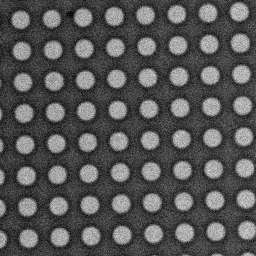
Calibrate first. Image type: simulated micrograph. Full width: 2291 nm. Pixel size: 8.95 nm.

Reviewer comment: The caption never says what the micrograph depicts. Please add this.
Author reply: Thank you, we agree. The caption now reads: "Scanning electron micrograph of an array of small figures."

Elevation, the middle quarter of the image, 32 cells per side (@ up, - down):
--------------------------------
--------------------@@-----@@@--
----@@@----@@@@----@@@@----@@@@-
---@@@@----@@@@----@@@@----@@@@-
---@@@@@---@@@@----@@@@----@@@@-
----@@@-----@@------@@----------
--------------------------------
--------------------------------
--------------------------------
-------------@------@@@----@@@@-
----@@@-----@@@----@@@@----@@@@-
---@@@@@---@@@@@---@@@@----@@@@-
----@@@@----@@@----@@@@----@@@@-
----@@@-----@@------------------
--------------------------------
--------------------------------
--------------------------------
-------------@@-----@@@-----@@@-
----@@@@----@@@@---@@@@@---@@@@-
----@@@@----@@@@---@@@@@---@@@@-
----@@@@----@@@@----@@@-----@@@-
-----@@-------------------------
--------------------------------
--------------------------------
-----------------------------@--
-----@@------@@-----@@@@----@@@@
----@@@@----@@@@----@@@@----@@@@
----@@@@----@@@@----@@@@----@@@@
----@@@@----@@@@----@@@------@@-
-----@@-------------------------
--------------------------------
--------------------------------